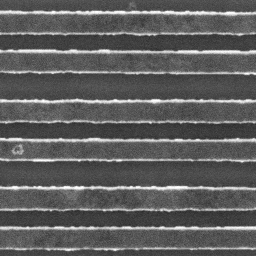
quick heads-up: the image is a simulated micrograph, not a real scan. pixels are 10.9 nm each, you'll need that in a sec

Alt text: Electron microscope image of lines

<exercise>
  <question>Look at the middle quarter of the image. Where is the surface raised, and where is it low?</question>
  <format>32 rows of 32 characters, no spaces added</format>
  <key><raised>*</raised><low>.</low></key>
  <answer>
********************************
********************************
................................
................................
................................
................................
................................
................................
................................
********************************
********************************
********************************
********************************
********************************
**....**************************
................................
................................
................................
................................
********************************
********************************
********************************
********************************
********************************
................................
................................
................................
................................
................................
................................
................................
********************************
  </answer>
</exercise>